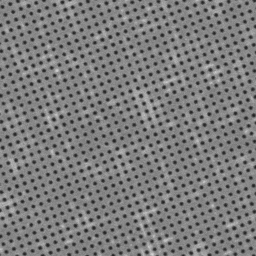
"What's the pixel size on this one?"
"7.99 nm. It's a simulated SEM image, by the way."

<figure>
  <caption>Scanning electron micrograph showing a regular array of holes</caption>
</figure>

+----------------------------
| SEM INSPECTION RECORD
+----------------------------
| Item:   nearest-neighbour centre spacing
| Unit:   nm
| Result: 63.9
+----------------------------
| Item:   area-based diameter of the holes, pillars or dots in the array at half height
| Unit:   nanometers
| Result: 31.2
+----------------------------